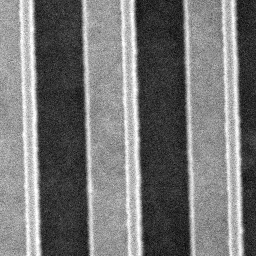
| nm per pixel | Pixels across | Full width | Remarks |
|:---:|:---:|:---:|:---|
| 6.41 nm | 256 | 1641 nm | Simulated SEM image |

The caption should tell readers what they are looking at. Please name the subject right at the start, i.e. lines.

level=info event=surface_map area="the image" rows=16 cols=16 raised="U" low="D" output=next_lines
UUDDDUUUDDDDUUUD
UUDDDUUUDDDDUUUD
UUDDDUUUDDDDUUUD
UUDDDUUUDDDDUUUD
UUDDDUUUDDDDUUUD
UUDDDUUUDDDDUUUD
UUDDDUUUDDDDUUUD
UUDDDUUUUDDDUUUD
UUDDDUUUUDDDUUUD
UUDDDDUUUDDDUUUD
UUDDDDUUUDDDUUUD
UUDDDDUUUDDDUUUD
UUDDDDUUUDDDUUUD
UUDDDDUUUDDDUUUD
UUDDDDUUUDDDUUUD
UUDDDDUUUDDDUUUD